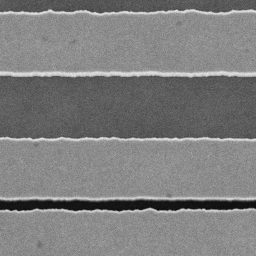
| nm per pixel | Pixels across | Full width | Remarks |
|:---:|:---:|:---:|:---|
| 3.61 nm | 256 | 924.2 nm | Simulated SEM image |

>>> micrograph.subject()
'lines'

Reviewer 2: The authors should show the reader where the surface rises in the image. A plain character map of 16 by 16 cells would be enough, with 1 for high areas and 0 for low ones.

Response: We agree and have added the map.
0000000000000000
1111111111111111
1111111111111111
1111111111111111
1111111111111111
0000000000000000
0000000000000000
0000000000000000
0000000000000000
1111111111111111
1111111111111111
1111111111111111
1111111111111111
1111111111111111
1111111111111111
1111111111111111